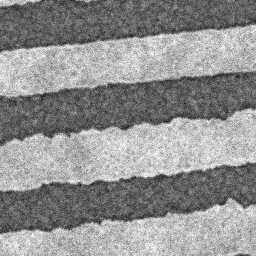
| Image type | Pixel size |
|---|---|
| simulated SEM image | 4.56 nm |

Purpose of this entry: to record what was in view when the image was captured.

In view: one or a few lines or trenches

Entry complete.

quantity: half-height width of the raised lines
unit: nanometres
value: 202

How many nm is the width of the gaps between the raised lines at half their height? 202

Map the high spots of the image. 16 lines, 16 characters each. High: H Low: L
LLLLLLLLLLLLLLLL
LLLLLLLLLLLLLLLL
LLLLLLLLHHHHHHHH
HHHHHHHHHHHHHHHH
HHHHHHHHHHHHHHLL
HHHHLLLLLLLLLLLL
LLLLLLLLLLLLLLLL
LLLLLLLLLLLHLHHH
LLHLHHHHHHHHHHHH
HHHHHHHHHHHHHHHH
HHHHHHHHHHHHLLLL
HHHLLLLLLLLLLLLL
LLLLLLLLLLLLLLLL
LLLLLLLLLLHHHHHH
LHHHHHHHHHHHHHHH
HHHHHHHHHHHHHHHH